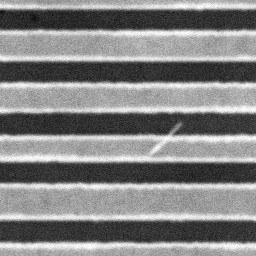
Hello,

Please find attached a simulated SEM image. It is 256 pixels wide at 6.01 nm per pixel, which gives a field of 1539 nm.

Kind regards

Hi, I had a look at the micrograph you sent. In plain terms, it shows lines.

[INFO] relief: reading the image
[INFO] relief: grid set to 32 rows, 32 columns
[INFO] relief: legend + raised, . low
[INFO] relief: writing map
++++++++++++++++++++++++++++++++
................................
................................
................................
++++++++++++++++++++++++++++++++
++++++++++++++++++++++++++++++++
++++++++++++++++++++++++++++++++
+++.+++.++..++++++++++++++++++++
................................
................................
+.+.....+.+...............++....
++++++++++++++++++++++++++++++++
++++++++++++++++++++++++++++++++
++++++++++++++++++++++++++++++++
................................
................................
................................
++++++++++++++++++++++++++++++++
++++++++++++++++++++++++++++++++
++++++++++++++++++++++++++++++++
................................
................................
................................
++++++++++++++++++++++++++++++++
++++++++++++++++++++++++++++++++
++++++++++++++++++++++++++++++++
++++++++++++++++++++++++++++++++
................................
................................
................................
..............++.....+..+.......
++++++++++++++++++++++++++++++++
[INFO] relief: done